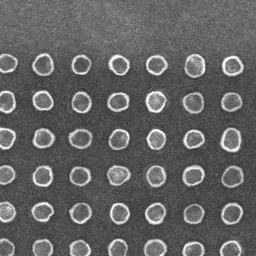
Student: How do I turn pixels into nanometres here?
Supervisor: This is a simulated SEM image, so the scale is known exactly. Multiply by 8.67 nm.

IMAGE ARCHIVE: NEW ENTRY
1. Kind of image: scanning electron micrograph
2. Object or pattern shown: a regular array of raised bodies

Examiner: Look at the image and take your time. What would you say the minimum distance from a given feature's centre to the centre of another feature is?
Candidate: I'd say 317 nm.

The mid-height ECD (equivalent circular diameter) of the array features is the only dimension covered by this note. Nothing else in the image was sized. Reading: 170 nm